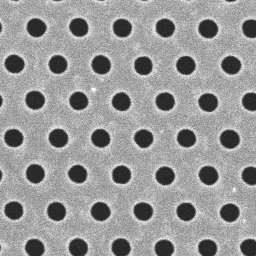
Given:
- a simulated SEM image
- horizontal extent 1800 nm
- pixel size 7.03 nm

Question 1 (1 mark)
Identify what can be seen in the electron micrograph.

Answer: a regular array of holes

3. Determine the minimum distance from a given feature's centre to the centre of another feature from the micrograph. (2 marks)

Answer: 295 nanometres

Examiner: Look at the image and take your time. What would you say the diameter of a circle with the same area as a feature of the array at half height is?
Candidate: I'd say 135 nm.